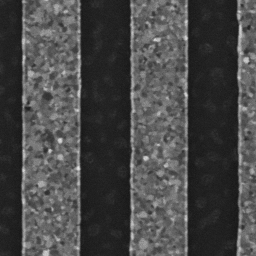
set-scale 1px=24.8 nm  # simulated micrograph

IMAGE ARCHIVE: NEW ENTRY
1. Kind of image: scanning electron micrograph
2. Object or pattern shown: one or a few lines or trenches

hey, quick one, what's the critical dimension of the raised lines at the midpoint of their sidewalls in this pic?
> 1380 nm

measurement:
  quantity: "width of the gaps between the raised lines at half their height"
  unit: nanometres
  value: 1300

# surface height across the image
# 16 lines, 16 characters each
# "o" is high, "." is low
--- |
.oooo...oooo...o
.oooo...oooo...o
.oooo...oooo...o
.oooo...oooo...o
.oooo...oooo...o
.oooo...oooo...o
.oooo...oooo...o
.oooo...oooo...o
.oooo...oooo...o
.oooo...oooo...o
.oooo...oooo...o
.oooo...oooo...o
.oooo...oooo...o
.oooo...oooo...o
.oooo...oooo...o
.oooo...oooo...o